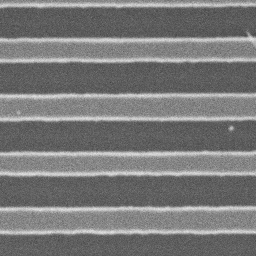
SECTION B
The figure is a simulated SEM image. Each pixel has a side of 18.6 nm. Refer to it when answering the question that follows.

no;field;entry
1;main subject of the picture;lines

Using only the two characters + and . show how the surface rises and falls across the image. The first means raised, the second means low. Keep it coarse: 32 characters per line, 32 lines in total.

++++++++++++++++++++++++++++++++
................................
................................
................................
................................
++++++++++++++++++++++++++++++++
++++++++++++++++++++++++++++++++
++++++++++++++++++++++++++++++++
................................
................................
................................
................................
++++++++++++++++++++++++++++++++
++++++++++++++++++++++++++++++++
++++++++++++++++++++++++++++++++
................................
................................
................................
................................
++++++++++++++++++++++++++++++++
++++++++++++++++++++++++++++++++
++++++++++++++++++++++++++++++++
................................
................................
................................
................................
++++++++++++++++++++++++++++++++
++++++++++++++++++++++++++++++++
++++++++++++++++++++++++++++++++
................................
................................
................................